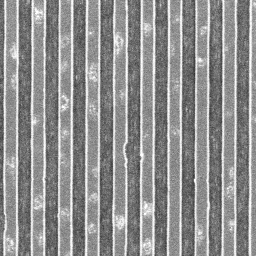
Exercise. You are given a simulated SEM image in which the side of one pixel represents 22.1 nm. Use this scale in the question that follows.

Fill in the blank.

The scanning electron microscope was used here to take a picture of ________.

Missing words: parallel lines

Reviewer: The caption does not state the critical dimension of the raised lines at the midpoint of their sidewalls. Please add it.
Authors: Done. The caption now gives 287 nm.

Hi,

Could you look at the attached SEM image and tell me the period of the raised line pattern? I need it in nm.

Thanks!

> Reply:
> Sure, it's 603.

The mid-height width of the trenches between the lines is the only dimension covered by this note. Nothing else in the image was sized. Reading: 0.309 micrometres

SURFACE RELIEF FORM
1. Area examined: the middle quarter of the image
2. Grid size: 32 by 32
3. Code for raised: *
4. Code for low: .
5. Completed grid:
**....***...****...***....***...
**....***...****...***....***...
**....***...****...***....***...
**....***...****...***....***...
**....***...****...***....***...
**....***...****...***....***...
**....***...****...***....***...
**....***...****...***....***...
**....***....***...***....***...
**....***....***...***....***...
**....***....***...***....***...
**....***....***...***....***...
**....***....***...***....***...
**....***....***...***....***...
**....***....***...***....***...
**....***....***...***....***...
**....***....***...***....***...
**....***....***...***....***...
**....***...****...***....***...
**....***...****...***....***...
**....***...***....***....***...
**....***....**....***....***...
**....***...***....***....***...
**....***...****....**....***...
**....***....***...***....***...
**....***....***...***....***...
**....***....***...***....***...
**....***....***...***....***...
**....***....***...***....***...
**....***....***...***....***...
**....***....***...***....***...
**....***....***...***....***...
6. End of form